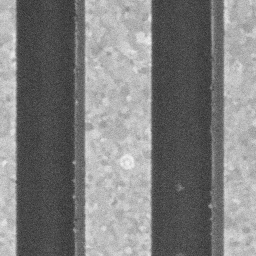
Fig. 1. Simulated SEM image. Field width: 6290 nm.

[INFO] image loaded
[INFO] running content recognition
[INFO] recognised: lines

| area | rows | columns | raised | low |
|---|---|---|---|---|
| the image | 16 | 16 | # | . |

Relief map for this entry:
#....####.....##
#....####.....##
#....####.....##
#....####.....##
#....####.....##
#....####.....##
#....####.....##
#....####.....##
#....####.....##
#....####.....##
#....####.....##
#....####.....##
#....####.....##
#....####.....##
#....####.....##
#....####.....##